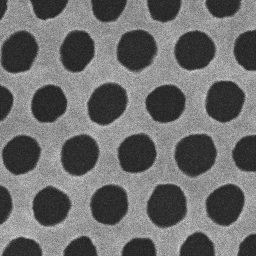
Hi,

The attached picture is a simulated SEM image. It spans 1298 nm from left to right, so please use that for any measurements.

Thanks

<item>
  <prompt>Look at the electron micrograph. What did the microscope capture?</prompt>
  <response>a regular array of holes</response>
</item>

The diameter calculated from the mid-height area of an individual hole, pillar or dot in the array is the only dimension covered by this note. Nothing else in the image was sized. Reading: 200 nanometres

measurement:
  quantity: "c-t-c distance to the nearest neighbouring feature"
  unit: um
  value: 0.295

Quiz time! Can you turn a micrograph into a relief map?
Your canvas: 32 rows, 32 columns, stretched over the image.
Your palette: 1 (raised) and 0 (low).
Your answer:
01110000111000001100000111000011
01110000111100011110001111000111
11111011111100111110001111111111
11111111111111111111111111111111
10001111000111100001111000111100
00000111000011100001110000011000
00000111000011100001110000011000
00001111000111100001110000111000
00001111000111110011111001111100
11111111111111111111111111111111
11111111111110111111111111100111
01110000111100001110000111000011
00110000111000001100000111000001
01110000111000001100000111000011
01110001111000011110001111000011
11111111111100111111111111111111
11111111111111111111111111111111
10001111100011110001111000011100
00000111000011100001110000011000
00000111000011100000110000011000
00000111000011100001110000011000
10001111000111110011111000111111
11111111111111111111111111111111
01111101111100011110001111100011
01111000111100001110000111000001
00110000011000001100000111000011
01110000011100001100000111000011
01111000111100011110000111100011
11111111111111111111011111111111
11111111111111111111111100111110
10000111100011110001111000011100
00000111000011100001110000011100